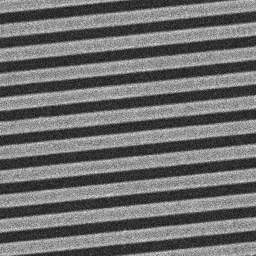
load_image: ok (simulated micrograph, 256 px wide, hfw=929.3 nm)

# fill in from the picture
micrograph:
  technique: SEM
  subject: parallel lines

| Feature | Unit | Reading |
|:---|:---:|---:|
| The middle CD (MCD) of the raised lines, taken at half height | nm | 46.4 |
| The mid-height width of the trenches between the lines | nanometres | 40.1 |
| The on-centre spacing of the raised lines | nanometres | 87.9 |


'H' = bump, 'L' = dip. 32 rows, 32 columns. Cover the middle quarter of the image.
LLLLHHHHHHHHHHHHHHHHHHHHHHHHHHHH
HHHHHHHHHHHHHHHHHHHHHHHLLLLLLLLL
HHHHHHHHHHHHHHLLLLLLLLLLLLLLLLLL
HHHHLLLLLLLLLLLLLLLLLLLLLLLLLLLL
LLLLLLLLLLLLLLLLLLLLLLLHHHHHHHHH
LLLLLLLLLLLLLHHHHHHHHHHHHHHHHHHH
LLLLHHHHHHHHHHHHHHHHHHHHHHHHHHHH
HHHHHHHHHHHHHHHHHHHHHHHLLLLLLLLL
HHHHHHHHHHHHHHHLLLLLLLLLLLLLLLLL
HHHHLLLLLLLLLLLLLLLLLLLLLLLLLLLL
LLLLLLLLLLLLLLLLLLLLLLLLHHHHHHHH
LLLLLLLLLLLLLLLHHHHHHHHHHHHHHHHH
LLLHHHHHHHHHHHHHHHHHHHHHHHHHHHHH
HHHHHHHHHHHHHHHHHHHHHHHHHLLLLLLL
HHHHHHHHHHHHHHHLLLLLLLLLLLLLLLLL
HHHHHHLLLLLLLLLLLLLLLLLLLLLLLLLL
LLLLLLLLLLLLLLLLLLLLLLHHHHHHHHHH
LLLLLLLLLLLLLLLHHHHHHHHHHHHHHHHH
LLLLHHHHHHHHHHHHHHHHHHHHHHHHHHHH
HHHHHHHHHHHHHHHHHHHHHHHHHLLLLLLL
HHHHHHHHHHHHHHHLLLLLLLLLLLLLLLLL
HHHHHHLLLLLLLLLLLLLLLLLLLLLLLLLL
LLLLLLLLLLLLLLLLLLLLLLLLHHHHHHHH
LLLLLLLLLLLLLLLHHHHHHHHHHHHHHHHH
LLLLLHHHHHHHHHHHHHHHHHHHHHHHHHHH
HHHHHHHHHHHHHHHHHHHHHHHHHLLLLLLL
HHHHHHHHHHHHHHHHHLLLLLLLLLLLLLLL
HHHHHHLLLLLLLLLLLLLLLLLLLLLLLLLL
LLLLLLLLLLLLLLLLLLLLLLLLLLHHHHHH
LLLLLLLLLLLLLLLLLHHHHHHHHHHHHHHH
LLLLLLLHHHHHHHHHHHHHHHHHHHHHHHHH
HHHHHHHHHHHHHHHHHHHHHHHHHHHLLLLL